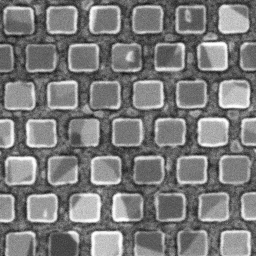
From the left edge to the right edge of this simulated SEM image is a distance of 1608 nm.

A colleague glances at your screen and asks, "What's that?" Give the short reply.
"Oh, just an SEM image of a regular array of raised bodies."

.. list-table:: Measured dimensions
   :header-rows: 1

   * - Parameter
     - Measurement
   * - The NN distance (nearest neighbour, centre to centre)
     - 269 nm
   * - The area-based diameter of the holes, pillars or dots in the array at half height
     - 0.195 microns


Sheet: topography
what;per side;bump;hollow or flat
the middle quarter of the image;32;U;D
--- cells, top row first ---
DUUUUUUUDDDDUUUUUUUDDDDUUUUUUUDD
DDUUUUDDDDDDDUUUUUUDDDDDUUUDDDDD
DDDDDDDDDDDDDDDDDDDDDDDDDDDDDDDD
DDDDDDDDDDDDDDDDDDDDDDDDDDDDDDDD
DDUDDDDDUUDDDDDDDDUUDDDUDDDDDUUU
UUUDDDDUUUUUUUDDDDUUUUUUUDDDUUUU
UUUDDDDUUUUUUUDDDDUUUUUUUDDDUUUU
UUUDDDDUUUUUUUDDDDUUUUUUDDDDUUUU
UUUDDDDUUUUUUUDDDUUUUUUUDDDDUUUU
UUUDDDDUUUUUUUDDDDUUUUUUDDDDUUUU
UUUDDDDUUUUUUUDDDDUUUUUUDDDDDUUU
DDDDDDDDDDDDDDDDDDDDDDDDDDDDDDDD
DDDDDDDDDDDDDDDDDDDDDDDDDDDDDDDD
DDDDDDDDDDDDDDDDDDDDDDDDDDDDDDDD
DUUUUUUUUDDDUUUUUUUDDDDUUUUUUUDD
DUUUUUUUUDDDUUUUUUUDDDDUUUUUUUDD
DUUUUUUUUDDDUUUUUUUDDDDUUUUUUUDD
DDUUUUUUUDDDUUUUUUUDDDDUUUUUUUDD
DUUUUUUUUDDDUUUUUUUDDDDUUUUUUUDD
DUUUUUUUUDDDUUUUUUUDDDDUUUUUUUDD
DDUUUUDDDDDDDDDUUDDDDDDDDDDDDDDD
DDDDDDDDDDDDDDDDDDDDDDDDDDDDDDDD
DDDDDDDDDDDDDDDDDDDDDDDDDDDDDDDD
UUUDDDDDUUUUUUDDDDUUUUUUUDDDDUUU
UUUDDDDUUUUUUUDDDDUUUUUUUDDDUUUU
UUUDDDDUUUUUUUDDDDUUUUUUUDDDUUUU
UUUDDDDUUUUUUUDDDDUUUUUUUDDDUUUU
UUUDDDDUUUUUUUDDDDUUUUUUUDDDUUUU
UUUDDDDUUUUUUUDDDDUUUUUUUDDDUUUU
UUUDDDDUUUUUUUDDDDUUUUUUDDDDDUUU
DDDDDDDDDDDDDDDDDDDDDDDDDDDDDDDD
DDDDDDDDDDDDDDDDDDDDDDDDDDDDDDDD